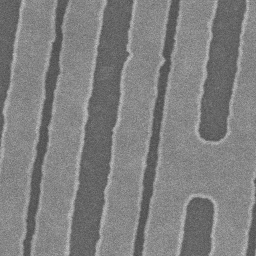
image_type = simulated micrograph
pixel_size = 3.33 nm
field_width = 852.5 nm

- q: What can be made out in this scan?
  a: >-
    parallel lines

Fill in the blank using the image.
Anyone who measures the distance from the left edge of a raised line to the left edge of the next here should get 54.9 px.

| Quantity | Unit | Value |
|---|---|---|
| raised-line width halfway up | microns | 0.115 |